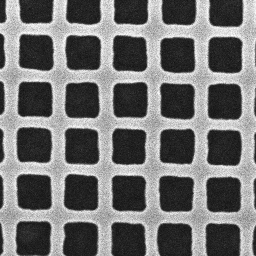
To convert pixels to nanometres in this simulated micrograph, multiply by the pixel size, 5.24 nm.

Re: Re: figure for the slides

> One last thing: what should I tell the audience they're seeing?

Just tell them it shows a regular array of holes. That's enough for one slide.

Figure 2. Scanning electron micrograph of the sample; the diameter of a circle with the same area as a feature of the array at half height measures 202 nanometres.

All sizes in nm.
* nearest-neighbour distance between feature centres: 243